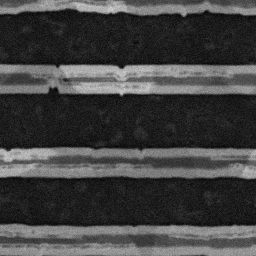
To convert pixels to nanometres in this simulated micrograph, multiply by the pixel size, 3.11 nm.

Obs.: one or a few lines or trenches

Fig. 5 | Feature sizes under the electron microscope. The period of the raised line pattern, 0.251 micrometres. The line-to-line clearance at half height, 0.19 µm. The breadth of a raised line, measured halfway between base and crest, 64.1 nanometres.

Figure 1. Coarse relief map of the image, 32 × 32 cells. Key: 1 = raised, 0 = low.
11111111111111111111111111111111
00000000000000000000000000000000
00000000000000000000000000000000
00000000000000000000000000000000
00000000000000000000000000000000
00000000000000000000000000000000
00000000000000000000000000000000
00000000000000000000000000000000
00000000000000000000010000000000
11111111111111111111111111111111
11111101111111111111111111111111
00000000000000000000000000000000
00000000000000000000000000000000
00000000000000000000000000000000
00000000000000000000000000000000
00000000000000000000000000000000
00000000000000000000000000000000
00000000000000000000000000000000
00000000000000000000000000000000
11111111111111111111111111111111
11111111111111111111111111111111
11000000000000001011000011100011
00000000000000000000000000000000
00000000000000000000000000000000
00000000000000000000000000000000
00000000000000000000000000000000
00000000000000000000000000000000
00000000000000000000000000000000
00000000000000000000000000000000
11111111111111111111111111111111
11111111111111111111111111111111
00000000000000000000000000010000